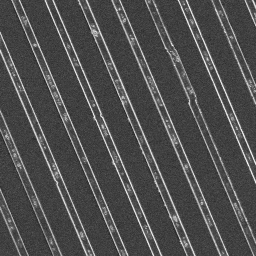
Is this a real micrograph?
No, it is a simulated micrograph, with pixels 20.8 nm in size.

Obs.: parallel lines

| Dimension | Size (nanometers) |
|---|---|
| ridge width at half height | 156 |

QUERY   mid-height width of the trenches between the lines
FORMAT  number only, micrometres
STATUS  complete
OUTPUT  0.491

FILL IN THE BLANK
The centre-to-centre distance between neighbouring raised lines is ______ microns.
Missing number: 0.638